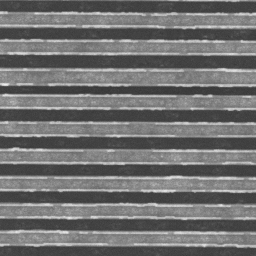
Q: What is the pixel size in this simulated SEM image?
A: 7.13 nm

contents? parallel lines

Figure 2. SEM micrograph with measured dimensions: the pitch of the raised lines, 0.195 µm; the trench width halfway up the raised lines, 87.3 nm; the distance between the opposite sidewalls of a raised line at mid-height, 108 nanometers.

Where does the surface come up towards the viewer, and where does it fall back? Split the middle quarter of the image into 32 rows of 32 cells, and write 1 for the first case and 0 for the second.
00000000000000000000000000000000
11111111111110011111111111111111
11111111111111111111111111111111
11111111111111111111111111111111
11111111111111111111111111111111
00000000000111111000000000011111
00000000000000000000000000000000
00000000000000000000000000000000
11111111111111111111111111111111
11111111111111111111111111111111
11111111111111111111111111111111
00000000000000000000000000000001
00000000000000000000000000000000
00000000000000000000000000000000
00001111000011000000000000000000
11111111111111111111111111111111
11111111111111111111111111111111
11111111111111111111111111111111
00000000000000000000000000000000
00000000000000000000000000000000
00000000000000000000000000000000
00000000000110000000001000111111
11111111111111111111111111111111
11111111111111111111111111111111
11111111111111111111111111111111
00000000000000000000000000000000
00000000000000000000000000000000
00000000000000000000000000000000
11111111111111111111111111111111
11111111111111111111111111111111
11111111111111111111111111111111
11111111111111111111111111111111